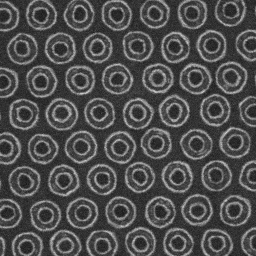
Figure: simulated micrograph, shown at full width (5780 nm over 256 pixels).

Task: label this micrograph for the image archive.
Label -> a regular array of ring-shaped raised bodies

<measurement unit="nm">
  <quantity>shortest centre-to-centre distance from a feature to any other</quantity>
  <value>831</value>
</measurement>